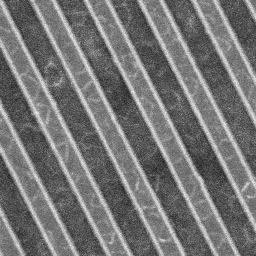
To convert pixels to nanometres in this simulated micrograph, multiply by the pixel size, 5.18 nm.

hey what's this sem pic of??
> parallel lines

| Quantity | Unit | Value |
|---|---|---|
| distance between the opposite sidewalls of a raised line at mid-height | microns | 0.0974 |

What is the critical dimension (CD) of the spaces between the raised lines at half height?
149 nanometers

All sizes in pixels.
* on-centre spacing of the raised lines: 47.8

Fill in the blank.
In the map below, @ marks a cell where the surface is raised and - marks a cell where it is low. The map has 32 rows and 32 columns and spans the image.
----@@@----@@@----@@-----@@----@
@----@@-----@@----@@@----@@@----
@----@@@----@@@----@@-----@@----
@@----@@-----@@----@@@----@@@---
@@----@@@----@@@----@@-----@@---
@@@----@@-----@@----@@@----@@@--
-@@----@@@----@@@----@@-----@@--
-@@@----@@-----@@----@@@----@@@-
--@@----@@@----@@@----@@-----@@-
--@@@----@@@----@@----@@@----@@@
---@@----@@@----@@@----@@-----@@
---@@@----@@-----@@----@@@----@@
----@@----@@@----@@@----@@-----@
----@@@----@@-----@@----@@@----@
@----@@----@@@----@@@----@@-----
@----@@@----@@-----@@----@@@----
@@----@@-----@@----@@@----@@----
@@----@@@----@@@----@@----@@@---
@@@----@@-----@@----@@@----@@---
-@@----@@@----@@-----@@----@@@--
-@@@----@@-----@@----@@@----@@@-
--@@----@@@----@@@----@@----@@@-
--@@@----@@-----@@----@@@----@@@
---@@----@@@----@@@----@@-----@@
---@@@----@@-----@@----@@@----@@
----@@----@@@----@@@----@@----@@
----@@@----@@-----@@----@@@----@
@----@@----@@@----@@@----@@-----
@----@@@----@@-----@@----@@@----
@@----@@----@@@----@@@----@@----
@@----@@@----@@-----@@----@@@---
@@@----@@----@@@----@@@----@@---